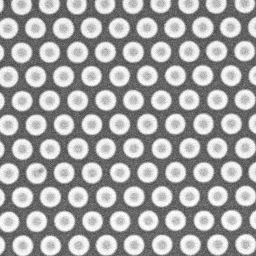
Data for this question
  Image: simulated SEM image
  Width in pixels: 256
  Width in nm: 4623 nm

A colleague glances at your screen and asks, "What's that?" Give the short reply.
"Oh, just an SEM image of an array of small figures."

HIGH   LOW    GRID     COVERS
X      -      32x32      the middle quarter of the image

--------------------------------
XX---XXXX---XXXX---XXXX---XXXX--
XX---XXXX---XXXX--XXXXX--XXXXX--
XX---XXXX---XXXX--XXXXX--XXXXX--
XX---XXXX---XXXX---XXXX---XXXX--
--------------------------------
--------------------------------
--XXX---XXXX---XXXX----XXX---XXX
-XXXXX--XXXXX--XXXXX--XXXXX--XXX
-XXXXX--XXXXX--XXXXX--XXXXX--XXX
-XXXXX---XXX---XXXXX--XXXX---XXX
---X----------------------------
--------------------------------
XX---XXXX---XXXX---XXXX---XXXX--
XX---XXXX--XXXXX--XXXXX---XXXX--
XX---XXXX--XXXXX--XXXXX---XXXX--
XX---XXXX---XXXX---XXXX---XXXX--
X-----XX------------------------
--------------------------------
--XXX----XXX---XXXX----XXX----XX
-XXXXX--XXXXX--XXXXX--XXXXX--XXX
-XXXXX--XXXXX--XXXXX--XXXXX--XXX
-XXXXX--XXXX---XXXX---XXXX---XXX
---XX-----X---------------------
--------------------------------
XX---XXXX---XXXX---XXXX---XXXX--
XX---XXXX---XXXX---XXXX---XXXX--
XX---XXXX---XXXX---XXXX---XXXX--
XX---XXXX---XXXX---XXXX---XXXX--
X-----XX------------------------
--------------------------------
--XXX----XXX----XXX----XXX----XX